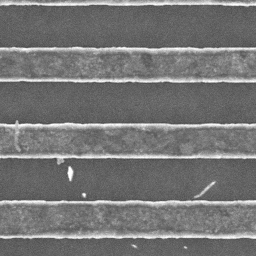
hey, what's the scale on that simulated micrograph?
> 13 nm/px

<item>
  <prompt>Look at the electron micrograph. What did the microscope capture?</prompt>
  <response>lines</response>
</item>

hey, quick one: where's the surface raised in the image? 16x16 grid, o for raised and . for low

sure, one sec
................
................
................
oooooooooooooooo
oooooooooooooooo
................
................
................
oooooooooooooooo
oooooooooooooooo
................
................
................
oooooooooooooooo
oooooooooooooooo
................